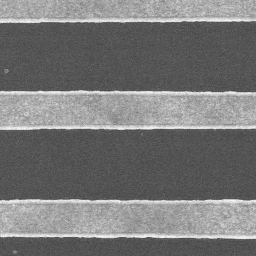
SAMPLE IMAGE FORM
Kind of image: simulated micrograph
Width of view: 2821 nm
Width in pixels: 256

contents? lines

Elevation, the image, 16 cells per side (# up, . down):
################
................
................
................
................
................
################
################
................
................
................
................
................
################
################
................